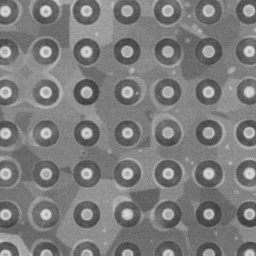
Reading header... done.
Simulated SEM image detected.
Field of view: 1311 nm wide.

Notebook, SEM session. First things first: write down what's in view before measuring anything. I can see an array of small figures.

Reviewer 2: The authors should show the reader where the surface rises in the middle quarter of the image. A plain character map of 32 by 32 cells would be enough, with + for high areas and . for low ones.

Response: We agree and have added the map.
+++++..+++++++++++++++++++.+++++
++++++++++++++++++++++++++++++++
++++++++++++++++++++++++++++++++
++++++++++++++++.+++++++++++++++
+++.....++++++.....++++.....++++
+++......++++.......++.......+++
++...++..++++..++...++...++..+++
++..+++..+++...++...++...++...++
+++......++++......+++.......+++
+++.....++++++.....++++.....++++
+++++.+++++++++..+++++++...+++++
++++++++++++++++++++++++++++++++
++++++++++++++++++++++++++++++++
++++++++++++++++++++++++...+++++
++++....++++++....+++++.....++++
+++......++++......+++.......+++
++...+...++++..++..+++...++...++
++...++..+++...++..+++...++...++
+++......++++......++++......+++
+++.....+++++.....+++++......+++
++++...++++++++..++++++++..+++++
++++++++++++++++++++++++++++++++
++++++++++++++++++++++++++++++++
++++++++++++++++++++++++++++++++
++++....++++++....++++++....++++
+++......++++......++++......+++
++...+...+++...+...++++..++...++
++...++..+++...++...++...++...++
++.......+++.......++++.......++
+++......++++......++++......+++
++++....++++++...+++++++....++++
++++++++++++++++++++++++++++++++